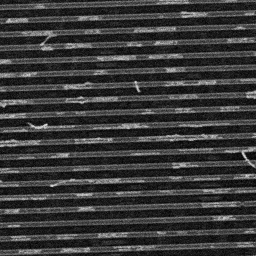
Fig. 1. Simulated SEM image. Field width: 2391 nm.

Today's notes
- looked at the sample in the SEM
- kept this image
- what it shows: parallel lines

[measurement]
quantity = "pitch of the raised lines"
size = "127 nm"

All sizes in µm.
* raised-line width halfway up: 0.0502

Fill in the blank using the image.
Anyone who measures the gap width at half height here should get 77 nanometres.